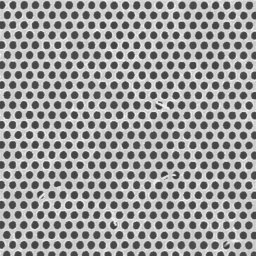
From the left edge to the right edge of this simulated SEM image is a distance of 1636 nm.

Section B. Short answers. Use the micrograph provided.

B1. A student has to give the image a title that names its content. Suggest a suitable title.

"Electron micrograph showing a regular array of holes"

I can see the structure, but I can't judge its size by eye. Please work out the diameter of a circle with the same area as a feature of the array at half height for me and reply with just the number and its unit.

49.9 nanometres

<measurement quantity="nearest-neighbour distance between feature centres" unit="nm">70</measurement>